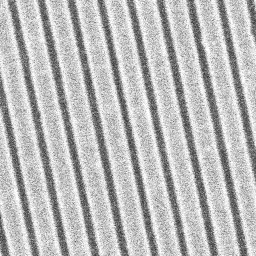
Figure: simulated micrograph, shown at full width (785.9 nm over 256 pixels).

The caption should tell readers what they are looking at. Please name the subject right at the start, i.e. parallel lines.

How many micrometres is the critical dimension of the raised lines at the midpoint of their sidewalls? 0.0645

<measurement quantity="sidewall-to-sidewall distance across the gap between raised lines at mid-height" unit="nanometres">27.1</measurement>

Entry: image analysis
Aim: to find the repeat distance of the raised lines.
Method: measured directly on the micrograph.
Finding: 89.6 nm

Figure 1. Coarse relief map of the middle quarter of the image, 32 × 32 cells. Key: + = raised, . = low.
++++..++++++..+++++..+++++...+++
++++...+++++..+++++..++++++..+++
+++++..+++++..+++++...+++++..+++
+++++..+++++..++++++..+++++..+++
+++++..++++++..+++++..+++++..+++
+++++..++++++..+++++..+++++...++
+++++...+++++..+++++...+++++..++
++++++..+++++..+++++...+++++..++
.+++++..+++++..++++++..+++++..++
.+++++..++++++.++++++..+++++...+
.+++++...+++++..+++++..+++++...+
.+++++...+++++..+++++...+++++..+
..+++++..+++++..+++++...+++++..+
..+++++..+++++...+++++..+++++..+
..+++++..++++++..+++++..+++++...
..+++++...+++++..+++++..++++++..
..+++++...+++++..+++++...+++++..
...+++++..+++++..++++++..+++++..
...+++++..++++++..+++++..+++++..
+..+++++..++++++..+++++..++++++.
+..+++++...+++++..+++++..++++++.
+..++++++..+++++..+++++...+++++.
+...+++++..+++++..++++++..+++++.
++..+++++..++++++..+++++..+++++.
++..+++++..++++++..+++++..++++++
++..+++++...+++++..+++++...+++++
++..++++++..+++++..+++++...+++++
++...+++++..+++++...+++++..+++++
+++..+++++..++++++..+++++..+++++
+++..+++++...+++++..+++++...++++
+++..+++++...+++++..+++++...++++
+++...+++++..+++++..++++++..++++